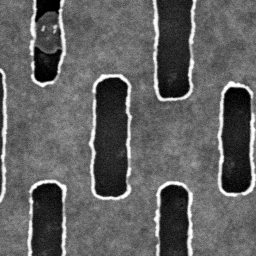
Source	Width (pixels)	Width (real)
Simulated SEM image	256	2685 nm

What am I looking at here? holes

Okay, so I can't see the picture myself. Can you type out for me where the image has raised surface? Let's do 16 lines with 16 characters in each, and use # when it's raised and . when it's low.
##..######..####
##..######..####
##..######..####
##..######..####
##..######..####
######..##..####
######..######..
######..######..
######..######..
######..######..
######..######..
######..######..
##..######..####
##..######..####
##..######..####
##..######..####